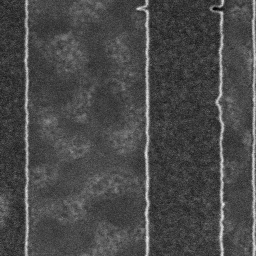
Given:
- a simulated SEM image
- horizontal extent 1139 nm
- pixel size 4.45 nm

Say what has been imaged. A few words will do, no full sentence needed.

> one or a few lines or trenches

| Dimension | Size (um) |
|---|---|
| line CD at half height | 0.336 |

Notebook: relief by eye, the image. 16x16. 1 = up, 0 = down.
1100000001111100
1100000001111100
1100000001111100
1100000001111100
1100000001111100
1100000001111100
1100000001111100
1100000001111100
1100000001111100
1100000001111100
1100000001111100
1100000001111100
1100000001111100
1100000001111100
1100000001111100
1100000001111100